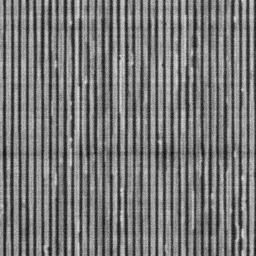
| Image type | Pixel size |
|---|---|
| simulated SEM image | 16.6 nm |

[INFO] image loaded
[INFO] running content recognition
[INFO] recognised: parallel lines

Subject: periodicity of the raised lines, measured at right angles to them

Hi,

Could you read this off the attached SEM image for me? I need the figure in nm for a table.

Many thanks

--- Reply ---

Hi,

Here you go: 126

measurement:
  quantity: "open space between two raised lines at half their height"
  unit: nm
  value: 83.1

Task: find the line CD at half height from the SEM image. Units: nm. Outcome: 43.6